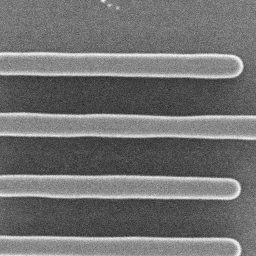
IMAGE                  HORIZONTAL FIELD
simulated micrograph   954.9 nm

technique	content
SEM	groups of lines, slits or small figures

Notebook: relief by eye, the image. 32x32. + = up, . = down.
................................
................................
................................
................................
................................
................................
................................
++++++++++++++++++++++++++++++..
++++++++++++++++++++++++++++++..
.................++++++++++++...
................................
................................
................................
................................
++++++++++++++++++..............
++++++++++++++++++++++++++++++++
++++++++++++++++++++++++++++++++
................................
................................
................................
................................
................................
+++++++++++++++++++++++++++++...
++++++++++++++++++++++++++++++..
.....+++++++++++++++++++++++++..
................................
................................
................................
................................
................................
++++++++++++++++++++++++++++++..
++++++++++++++++++++++++++++++..